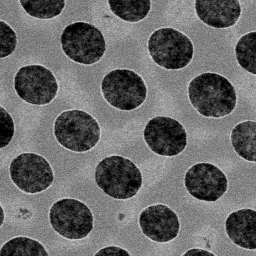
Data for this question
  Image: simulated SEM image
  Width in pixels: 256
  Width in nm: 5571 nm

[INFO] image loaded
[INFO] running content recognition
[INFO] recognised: a regular array of holes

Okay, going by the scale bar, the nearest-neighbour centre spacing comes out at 1340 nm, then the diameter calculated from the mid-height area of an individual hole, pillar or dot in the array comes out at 0.94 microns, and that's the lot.